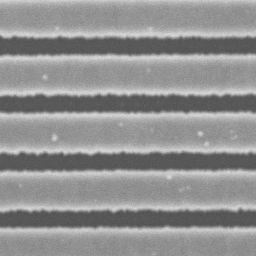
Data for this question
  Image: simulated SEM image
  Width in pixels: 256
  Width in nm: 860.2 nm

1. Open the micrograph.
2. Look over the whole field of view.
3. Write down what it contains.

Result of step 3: lines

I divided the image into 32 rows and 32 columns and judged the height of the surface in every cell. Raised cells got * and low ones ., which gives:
********************************
********************************
********************************
********************************
************************.*******
................................
................................
********************************
********************************
********************************
********************************
********************************
................................
................................
********************************
********************************
********************************
********************************
********************************
................................
................................
********************************
********************************
********************************
********************************
********************************
................................
................................
.......*..*.*.......**..****.*.*
********************************
********************************
********************************